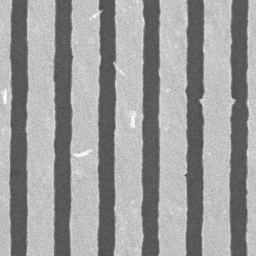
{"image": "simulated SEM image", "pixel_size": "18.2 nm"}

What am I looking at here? parallel lines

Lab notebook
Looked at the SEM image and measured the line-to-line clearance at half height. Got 283 nm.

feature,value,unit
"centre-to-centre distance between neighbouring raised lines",803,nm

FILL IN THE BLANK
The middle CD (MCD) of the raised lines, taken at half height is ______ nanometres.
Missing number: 513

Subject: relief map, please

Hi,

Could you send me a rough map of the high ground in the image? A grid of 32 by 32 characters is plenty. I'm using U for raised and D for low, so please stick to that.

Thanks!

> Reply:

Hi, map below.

UUDUUUUDDUUUDDUUUUDDUUUDDUUUUDDU
UDDUUUUDDUUUUDUUUUDDUUUDDUUUUDDU
UDDUUUUDDUUUDDUUUUDDUUUDDDUUUDDU
UDDUUUUDDUUUDDUUUUDDUUUDDDUUUDDU
UDDUUUUDDUUUDDUUUUDDUUUDDDUUUDDU
UDDUUUUDDUUUDDUUUUDDUUUDDUUUUDDU
UDDUUUUDDUUUUDUUUUDDUUUDDUUUUDDU
UDDUUUUDDUUUUDUUUUDDUUUDDUUUUDDU
UDDUUUUDDUUUDDUUUUDDUUUDDUUUUDDU
UDDUUUUDDUUUDDUUUUDDUUUDDUUUUDDU
UDDUUUUDDUUUDDUUUUDDUUUDDUUUUDDU
UUDUUUUDDUUUDDUUUUDDUUUDDUUUUDDU
UUDUUUUDDUUUDDUUUUDDUUUDDUUUUDDU
UDDUUUUDDUUUDDUUUUDDUUUDDUUUUDDU
UDDUUUUDDUUUDDUUUUDDUUUDDUUUUDDU
UDDUUUUDDUUUDDUUUUDDUUUDDUUUUDDU
UDDUUUUDDUUUDDUUUUDDUUUDDUUUUDDU
UDDUUUUDDUUUDDUUUUDDUUUDDUUUUDDU
UDDUUUUDDUUUDDUUUUDDUUUUDUUUUDDU
UDDUUUUDDUUUDDUUUUDDUUUDDUUUUDDU
UDDUUUUDDUUUDDUUUUDDUUUDDUUUUDDU
UDDUUUUDDUUUDDUUUUDDUUUDDUUUUDDU
UDDUUUUDDUUUDDUUUUDDUUUDDUUUUDDU
UDDUUUUDDUUUDDUUUUDDUUUDDUUUUDDU
UDDUUUUDDUUUDDUUUUDDUUUDDUUUUDDU
UDDUUUUDDUUUDDUUUUDDUUUDDUUUUDDU
UDDUUUUDDUUUDDUUUUDDUUUDDUUUUDDU
UDDUUUUDDUUUDDUUUUDDUUUDDUUUUDDU
UDDUUUUDDUUUDDUUUUDDUUUDDUUUUDDU
UDDUUUUDDUUUDDUUUUDDUUUDDUUUUDDU
UDDUUUUDDUUUDDUUUUDDUUUDDUUUUDDU
UDDUUUUDDUUUDDUUUUDDUUUDDUUUUDDU